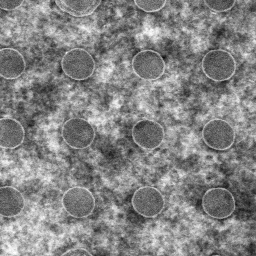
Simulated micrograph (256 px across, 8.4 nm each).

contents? a regular array of raised bodies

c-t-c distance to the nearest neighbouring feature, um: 0.579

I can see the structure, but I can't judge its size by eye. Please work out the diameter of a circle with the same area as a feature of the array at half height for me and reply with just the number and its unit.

267 nanometres